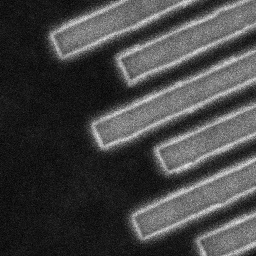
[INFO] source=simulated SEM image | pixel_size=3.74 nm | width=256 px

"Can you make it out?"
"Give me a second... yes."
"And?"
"parallel lines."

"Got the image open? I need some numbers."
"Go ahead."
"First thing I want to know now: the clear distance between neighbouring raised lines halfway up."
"90.8 nm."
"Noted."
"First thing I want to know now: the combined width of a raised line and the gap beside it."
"0.183 µm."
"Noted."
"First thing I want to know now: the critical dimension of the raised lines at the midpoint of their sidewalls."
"93.8 nm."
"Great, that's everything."